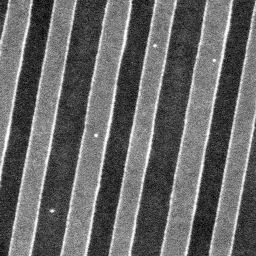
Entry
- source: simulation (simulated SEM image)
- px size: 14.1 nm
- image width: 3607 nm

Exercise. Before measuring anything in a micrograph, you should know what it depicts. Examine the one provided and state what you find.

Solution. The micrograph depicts lines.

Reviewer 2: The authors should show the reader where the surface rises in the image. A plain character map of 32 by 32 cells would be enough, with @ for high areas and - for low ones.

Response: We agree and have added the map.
-@@@---@@----@@@---@@@----@@@---
-@@@---@@----@@@---@@@----@@@---
-@@@--@@@----@@@---@@@---@@@@---
@@@---@@@----@@@---@@----@@@---@
@@@---@@@----@@@---@@----@@@---@
@@@---@@@---@@@---@@@----@@@---@
@@@---@@----@@@---@@@----@@@---@
@@@---@@----@@@---@@@----@@@---@
@@---@@@----@@@---@@----@@@---@@
@@---@@@----@@@---@@----@@@---@@
@@---@@@---@@@@---@@----@@@---@@
@@---@@----@@@---@@@----@@@---@@
@@---@@----@@@---@@@----@@@---@@
@@--@@@----@@@---@@@---@@@@---@@
@---@@@----@@@---@@----@@@---@@@
@---@@@----@@@---@@----@@@---@@@
@---@@@----@@---@@@----@@@---@@@
@---@@----@@@---@@@----@@@---@@-
@---@@----@@@---@@@----@@@---@@-
---@@@----@@@---@@----@@@---@@@-
---@@@----@@@---@@----@@@---@@@-
---@@@----@@@---@@----@@@---@@@-
---@@----@@@---@@@----@@@---@@--
---@@----@@@---@@@----@@@---@@--
--@@@----@@@---@@@---@@@@---@@--
--@@@----@@@---@@----@@@---@@@--
--@@@----@@@---@@----@@@---@@@--
--@@@---@@@---@@@----@@@---@@@--
--@@----@@@---@@@----@@@---@@---
--@@----@@@---@@@----@@@---@@---
-@@@----@@@---@@----@@@---@@@---
-@@@----@@@---@@----@@@---@@@---